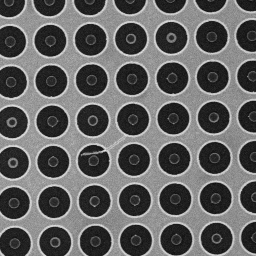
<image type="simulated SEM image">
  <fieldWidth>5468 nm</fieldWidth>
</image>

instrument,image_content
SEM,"an array of small figures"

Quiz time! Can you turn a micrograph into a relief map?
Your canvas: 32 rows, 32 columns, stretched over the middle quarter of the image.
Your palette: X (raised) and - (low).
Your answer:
XXXXX----XXXXXX-----XXXX------XX
XXXX------XXXX------XXXX-------X
-XX--------XX--------XX---XX---X
-XX---XX---XX---XX---XX---XX---X
-XX---XX---XX---XX---XX---XX---X
-XX--------XX--------XX--------X
XXXX------XXXX------XXXX------XX
XXXXX----XXXXXX----XXXXXXX--XXXX
XXXXXXXXXXXXXXXXXXXXXXXXXXXXXXXX
XXXXXXXXXXXXXXXXXXXXXXXXXXX-XXXX
XXXXX----XXXXXX-----XXXXX-----XX
XXXX-------XXX-------XXX-------X
-XX--------XX--------XX----X---X
-XX---XX---XX---XX---XX---XX----
-XX---XX---XX---XX---XX---XX---X
-XX--------XX--------XXX-------X
-XXX-------XXX-------XXX------XX
XXXXX-----XXXXX----XXXXXXX---XXX
XXXXXXXXXXXXXXXXXXXXXXXXXXXXXXXX
XXXXXXXXXXXXXXXXXXXXXXXXXXXXXXXX
XXXXXX---XXXXXX-----XXXXX-----XX
XXXX------XXXX-------XXX-------X
-XXX-------XXX-------XXX--------
-XX----X----X---XXX---X---XXX---
--X---XX----X----XX---X----X----
-XX--------XXX-------XXX-------X
-XXX-------XXX-------XXXX------X
XXXXX-----XXXXX-----XXXXXX----XX
XXXXXXX-XXXXXXXXXXXXXXXXXXXXXXXX
XXXXXXXXXXXXXXXXXXXXXXXXXXXXXXXX
XXXXXX---XXXXXX-----XXXXX-----XX
XXXXX------XXX-------XXX-------X